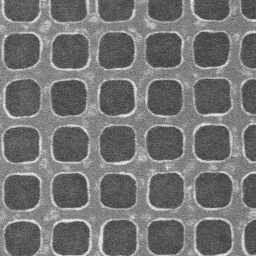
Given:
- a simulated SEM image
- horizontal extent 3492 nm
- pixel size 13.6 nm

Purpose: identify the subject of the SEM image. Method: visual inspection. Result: a regular array of holes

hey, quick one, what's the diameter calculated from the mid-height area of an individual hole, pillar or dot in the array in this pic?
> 532 nanometers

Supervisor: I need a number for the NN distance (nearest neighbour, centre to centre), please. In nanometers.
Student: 634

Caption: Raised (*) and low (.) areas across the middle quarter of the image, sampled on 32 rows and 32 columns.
.....****.......*****.......****
********************************
********************************
********************************
.....*****.......*****.......***
.....****........****........***
......***.........***.........**
......***.........***.........**
......**..........***.........**
......**..........***.........**
.....****.........***.........**
.....****........****........***
....******......******......****
********************************
********************************
...********.....*******....*****
.....*****........***........***
......***.........***.........**
......***.........***.........**
......***.........**..........**
......***.........***.........**
......***.........***.........**
......***.........***.........**
.....*****.......*****......****
....*******.....****************
********************************
********************************
....*******....********......***
.....*****.......*****........**
......***.........***.........**
......***.........***.........**
......***.........***.........**